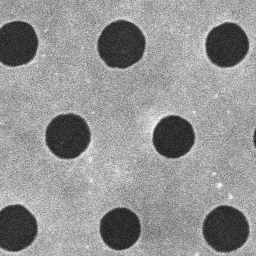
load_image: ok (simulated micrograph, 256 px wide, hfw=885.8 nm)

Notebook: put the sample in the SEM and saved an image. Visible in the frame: holes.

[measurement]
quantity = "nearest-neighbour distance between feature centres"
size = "0.365 µm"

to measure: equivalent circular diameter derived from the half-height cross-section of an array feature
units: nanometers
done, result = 154